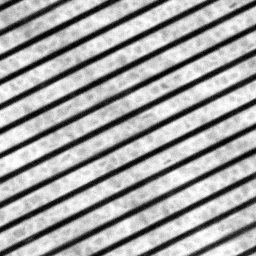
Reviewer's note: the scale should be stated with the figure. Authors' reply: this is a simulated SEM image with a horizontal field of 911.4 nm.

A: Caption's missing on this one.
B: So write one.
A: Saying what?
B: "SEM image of parallel lines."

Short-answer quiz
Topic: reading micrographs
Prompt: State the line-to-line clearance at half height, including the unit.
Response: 22.7 nanometres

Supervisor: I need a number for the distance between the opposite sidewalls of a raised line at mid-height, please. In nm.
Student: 54.4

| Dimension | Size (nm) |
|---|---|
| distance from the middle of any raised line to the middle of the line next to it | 78.2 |